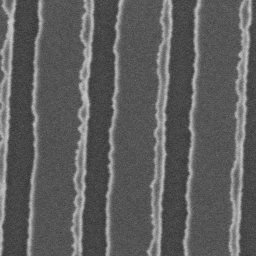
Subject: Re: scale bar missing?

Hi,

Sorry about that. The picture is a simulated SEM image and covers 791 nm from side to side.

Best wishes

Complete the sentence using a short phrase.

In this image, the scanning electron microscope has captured lines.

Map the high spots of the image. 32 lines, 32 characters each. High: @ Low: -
@@---@@@@@@@---@@@@@@----@@@@@@-
@@---@@@@@@@---@@@@@@----@@@@@@-
@@---@@@@@@@---@@@@@@----@@@@@@-
@@---@@@@@@@--@@@@@@@---@@@@@@@-
@@---@@@@@@@---@@@@@@---@@@@@@@-
@---@@@@@@@---@@@@@@@---@@@@@@@-
@---@@@@@@@---@@@@@@@----@@@@@@-
@---@@@@@@@---@@@@@@@----@@@@@@-
@---@@@@@@@---@@@@@@@---@@@@@@@-
@---@@@@@@@---@@@@@@@---@@@@@@@-
@---@@@@@@@---@@@@@@@---@@@@@@@-
@---@@@@@@@---@@@@@@@---@@@@@@@-
@---@@@@@@@---@@@@@@@---@@@@@@@-
@---@@@@@@@---@@@@@@@---@@@@@@@-
@---@@@@@@@---@@@@@@@---@@@@@@@-
@---@@@@@@@---@@@@@@@---@@@@@@@-
@---@@@@@@@---@@@@@@----@@@@@@@-
@---@@@@@@@---@@@@@@----@@@@@@--
@---@@@@@@@---@@@@@@@---@@@@@@--
@---@@@@@@@---@@@@@@@---@@@@@@--
@---@@@@@@@---@@@@@@----@@@@@@--
@---@@@@@@@---@@@@@@----@@@@@@--
@---@@@@@@----@@@@@@----@@@@@@--
@---@@@@@@@---@@@@@@----@@@@@@--
----@@@@@@---@@@@@@@---@@@@@@@--
----@@@@@@---@@@@@@@---@@@@@@@--
----@@@@@@---@@@@@@@----@@@@@@--
----@@@@@@---@@@@@@@---@@@@@@@--
----@@@@@@---@@@@@@@---@@@@@@@--
----@@@@@@---@@@@@@@---@@@@@@@--
----@@@@@@---@@@@@@@---@@@@@@@--
----@@@@@@---@@@@@@@---@@@@@@@--